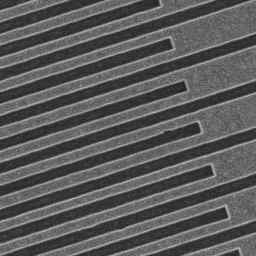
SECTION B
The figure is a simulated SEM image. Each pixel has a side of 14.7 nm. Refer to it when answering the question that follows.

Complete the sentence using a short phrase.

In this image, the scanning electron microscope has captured parallel lines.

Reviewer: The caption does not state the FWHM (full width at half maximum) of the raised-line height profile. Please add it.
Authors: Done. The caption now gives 10.5 px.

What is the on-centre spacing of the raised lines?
326 nm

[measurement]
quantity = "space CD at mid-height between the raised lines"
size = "11.4 px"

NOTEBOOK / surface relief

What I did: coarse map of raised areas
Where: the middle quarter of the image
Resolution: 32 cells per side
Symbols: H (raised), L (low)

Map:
HHHHLLLLLLLLLLHHHHHHHHLLLLLLLLLL
HLLLLLLLLLLHHHHHHHHLLLLLLLLLLHHH
LLLLLLLHHHHHHHHHHLLLLLLLLHHHHHHH
LLLLHHHHHHHHHLLLLLLLLLLHHHHHHHHH
LHHHHHHHHHLLLLLLLLLHHHHHHHHHHLHH
HHHHHHHLLLLLLLLLHHHHHHHHHLLLLLLH
HHHHLLLLLLLLLHHHHHHHHHLLLLLLLLLH
LLLLLLLLLLHHHHHHHHHLLLLLLLLLLHHH
LLLLLLLHHHHHHHHHLLLLLLLLLHHHHHHH
LLLLHHHHHHHHHLLLLLLLLLHHHHHHHHHH
HHHHHHHHHHLLLLLLLLLHHHHHHHHHLLLL
HHHHHHHLLLLLLLLLHHHHHHHHHLLLLLLL
HHHHLLLLLLLLLHHHHHHHHLLLLLLLLLLH
LLLLLLLLLLHHHHHHHHLLLLLLLLLLHHHH
LLLLLLLHHHHHHHHLLLLLLLLLLHHHHHHH
LLLLHHHHHHHHLLLLLLLLLLHHHHHHHHLL
HHHHHHHHHLLLLLLLLLHHHHHHHHLLLLLL
HHHHHHLLLLLLLLLHHHHHHHHHLLLLLLLL
HHHLLLLLLLLLHHHHHHHHHLLLLLLLLLHH
LLLLLLLLLHHHHHHHHHLLLLLLLLLHHHHH
LLLLLLHHHHHHHHLLLLLLLLLLHHHHHHHH
LLLHHHHHHHHLLLLLLLLLLHHHHHHHHHLL
HHHHHHHHLLLLLLLLLLHHHHHHHHHLLLLL
HHHHHLLLLLLLLLHHHHHHHHHHLLLLLLLL
HHHLLLLLLLLHHHHHHHHHHLLLLLLLLLHH
LLLLLLLLHHHHHHHHHHLLLLLLLLLHHHHH
LLLLLHHHHHHHHHLLLLLLLLLLHHHHHHHH
LLHHHHHHHHHLLLLLLLLLLHHHHHHHHLLL
HHHHHHHHHLLLLLLLLLHHHHHHHHLLLLLL
HHHHHLLLLLLLLLHHHHHHHHHLLLLLLLLL
HHLLLLLLLLLHHHHHHHHHLLLLLLLLLHHH
LLLLLLLLHHHHHHHHHLLLLLLLLLHHHHHH